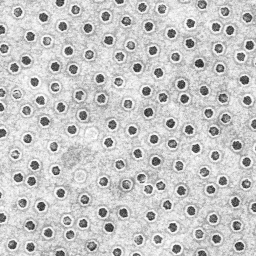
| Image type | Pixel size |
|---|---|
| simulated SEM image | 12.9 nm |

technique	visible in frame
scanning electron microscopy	a regular array of holes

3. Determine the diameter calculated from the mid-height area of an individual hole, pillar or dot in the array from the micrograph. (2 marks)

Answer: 10.4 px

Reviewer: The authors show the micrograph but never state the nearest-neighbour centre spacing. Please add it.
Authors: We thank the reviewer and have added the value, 249 nm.